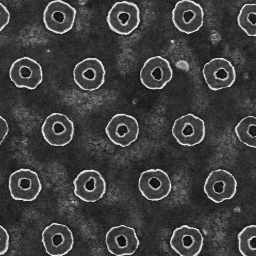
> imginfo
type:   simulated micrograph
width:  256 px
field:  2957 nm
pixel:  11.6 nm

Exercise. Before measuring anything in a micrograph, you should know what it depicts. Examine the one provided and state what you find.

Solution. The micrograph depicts a regular array of ring-shaped raised bodies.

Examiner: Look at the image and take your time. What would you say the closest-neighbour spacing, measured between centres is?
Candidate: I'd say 737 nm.